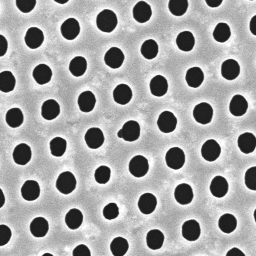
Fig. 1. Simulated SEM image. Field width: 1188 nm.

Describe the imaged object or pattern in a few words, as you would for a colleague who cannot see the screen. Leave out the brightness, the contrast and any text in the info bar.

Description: a regular array of holes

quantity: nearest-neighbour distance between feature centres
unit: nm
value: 169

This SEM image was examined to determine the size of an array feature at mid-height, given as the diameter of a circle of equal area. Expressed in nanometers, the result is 93.4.